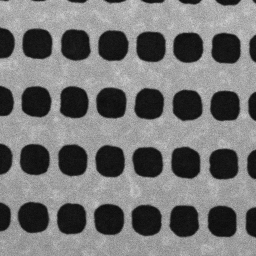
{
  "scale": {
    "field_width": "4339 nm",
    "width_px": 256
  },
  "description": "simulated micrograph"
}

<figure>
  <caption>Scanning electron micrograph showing a regular array of holes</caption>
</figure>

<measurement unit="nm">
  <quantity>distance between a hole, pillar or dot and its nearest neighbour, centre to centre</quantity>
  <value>638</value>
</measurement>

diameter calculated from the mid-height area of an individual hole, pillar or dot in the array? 0.531 µm